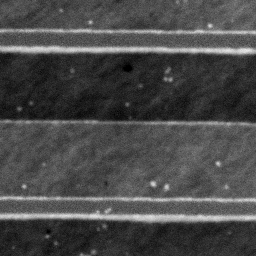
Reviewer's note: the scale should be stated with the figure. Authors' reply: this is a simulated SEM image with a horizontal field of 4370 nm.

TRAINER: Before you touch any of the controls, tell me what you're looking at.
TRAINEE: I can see lines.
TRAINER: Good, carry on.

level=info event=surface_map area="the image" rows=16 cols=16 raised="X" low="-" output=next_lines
XXXXXXXXXXXXXXXX
XXXXXXXXXXXXXXXX
XXXXXXXXXXXXXXXX
----------------
----------------
----------------
----------------
----------------
XXXXXXXXXXXXXXXX
XXXXXXXXXXXXXXXX
XXXXXXXXXXXXXXXX
XXXXXXXXXXXXXXXX
XXXXXXXXXXXXXXXX
------XXXXXXXXXX
----------------
----------------